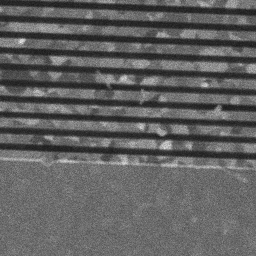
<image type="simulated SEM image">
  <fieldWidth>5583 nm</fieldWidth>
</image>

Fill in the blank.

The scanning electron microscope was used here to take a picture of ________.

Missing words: parallel lines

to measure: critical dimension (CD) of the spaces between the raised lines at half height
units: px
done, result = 6.87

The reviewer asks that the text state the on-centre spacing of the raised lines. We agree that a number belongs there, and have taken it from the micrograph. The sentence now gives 349 nm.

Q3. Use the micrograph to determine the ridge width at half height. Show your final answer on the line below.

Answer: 196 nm